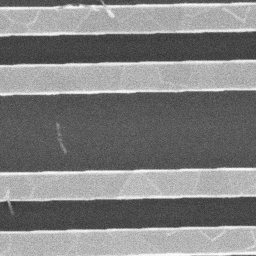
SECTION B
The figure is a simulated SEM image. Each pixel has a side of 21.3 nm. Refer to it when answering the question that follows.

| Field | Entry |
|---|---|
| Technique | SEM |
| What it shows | lines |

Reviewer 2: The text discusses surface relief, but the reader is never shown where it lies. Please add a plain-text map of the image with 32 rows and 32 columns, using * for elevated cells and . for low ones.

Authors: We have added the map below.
.............................***
********************************
********************************
********************************
................................
................................
................................
................................
********************************
********************************
********************************
****************................
................................
................................
................................
................................
................................
................................
................................
................................
................................
...........*********************
********************************
********************************
****************************....
................................
................................
................................
.......................*********
********************************
********************************
********************************